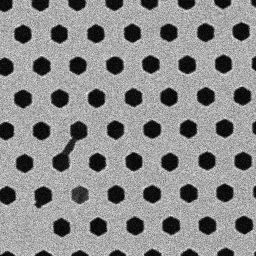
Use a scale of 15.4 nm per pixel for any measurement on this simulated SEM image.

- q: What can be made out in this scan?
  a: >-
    a regular array of holes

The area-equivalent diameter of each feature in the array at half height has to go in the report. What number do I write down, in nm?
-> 283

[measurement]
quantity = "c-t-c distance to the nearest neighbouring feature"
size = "0.556 µm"